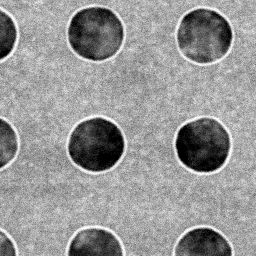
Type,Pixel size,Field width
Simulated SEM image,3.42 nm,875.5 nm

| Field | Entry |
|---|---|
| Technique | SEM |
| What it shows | holes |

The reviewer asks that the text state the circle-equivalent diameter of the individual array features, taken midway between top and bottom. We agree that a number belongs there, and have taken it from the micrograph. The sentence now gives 196 nm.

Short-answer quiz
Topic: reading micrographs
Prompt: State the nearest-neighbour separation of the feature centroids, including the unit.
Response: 0.368 µm